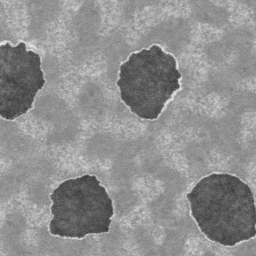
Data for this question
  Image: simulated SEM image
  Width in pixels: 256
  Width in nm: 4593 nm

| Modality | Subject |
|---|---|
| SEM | holes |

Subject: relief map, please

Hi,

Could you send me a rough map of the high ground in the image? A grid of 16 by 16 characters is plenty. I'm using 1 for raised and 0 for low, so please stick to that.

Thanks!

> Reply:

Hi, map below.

1111111111111111
1111111111111111
1111111111111111
0011111100011111
0001111000011111
0001111000011111
0011111100111111
1111111111111111
1111111111111111
1111111111111111
1111111111111111
1111001111110001
1110000111110000
1110000111110000
1110001111111000
1111111111111111